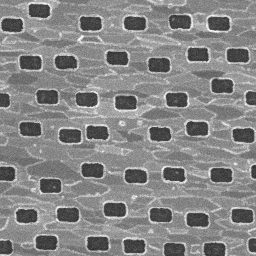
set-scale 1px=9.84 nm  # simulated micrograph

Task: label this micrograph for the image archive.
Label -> a regular array of holes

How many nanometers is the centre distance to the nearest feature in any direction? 358